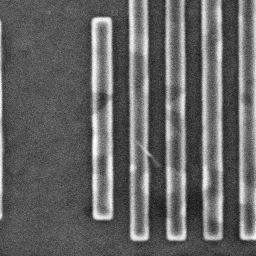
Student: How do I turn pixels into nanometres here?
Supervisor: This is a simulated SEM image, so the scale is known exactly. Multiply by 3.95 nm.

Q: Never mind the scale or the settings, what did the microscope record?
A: wiring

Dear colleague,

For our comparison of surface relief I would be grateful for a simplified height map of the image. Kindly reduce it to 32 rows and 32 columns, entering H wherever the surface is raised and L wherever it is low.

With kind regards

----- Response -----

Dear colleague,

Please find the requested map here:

LLLLLLLLLLLLLLLLHHLLLHHLLHHLLLHH
LLLLLLLLLLLLLLLLHHLLLHHLLHHLLLHH
LLLLLLLLLLLLHLLLHHLLLHHLLHHHLLHH
LLLLLLLLLLLLHHLLHHLLLHHLLHHHLLHH
LLLLLLLLLLLLHHLLHHLLLHHLLHHHLLHH
LLLLLLLLLLLLHHLLHHLLLHHLLHHHLLHH
LLLLLLLLLLLLHHLLHHLLLHHLLHHHLLHH
LLLLLLLLLLLLHHLLHHLLLHHLLLHHLLHH
LLLLLLLLLLLLHHLLHHLLLHHLLLHHLLHH
LLLLLLLLLLLLHHLLHHLLLHHLLHHHLLHH
LLLLLLLLLLLLHHLLHHLLLHHLLHHHLLHH
LLLLLLLLLLLLHHLLHHLLLHHLLHHHLLHH
LLLLLLLLLLLLHHLLHHLLLHHLLLHHLLHH
LLLLLLLLLLLLHHLLHHLLLHHLLLHHLLHH
LLLLLLLLLLLLHHLLHHLLLHHLLLHHLLHH
LLLLLLLLLLLLHHLLHHLLLHHLLLHHLLHH
LLLLLLLLLLLLHHLLHHLLLHHLLLHHLLHH
LLLLLLLLLLLLHHLLHHLLLHHLLLHHLLHH
LLLLLLLLLLLLHHLLHHLLLHHLLLHHLLHH
LLLLLLLLLLLLHHLLHHLLLHHLLLHHLLHH
LLLLLLLLLLLLHHLLHHLLLHHLLLHHLLHH
LLLLLLLLLLLLHHLLHHLLLHHLLLHHLLHH
LLLLLLLLLLLLHHLLHHLLLHHLLLHHLLHH
LLLLLLLLLLLLHHLLHHLLLHHLLLHHLLHH
LLLLLLLLLLLLHHLLHHLLLHHLLLHHLLHH
LLLLLLLLLLLLHHLLHHLLLHHLLLHHLLHH
LLLLLLLLLLLLHHLLHHLLLHHLLLHHLLHH
LLLLLLLLLLLLLLLLLHLLLHHLLLHHLLHH
LLLLLLLLLLLLLLLLHHLLLHHLLLHHLLHH
LLLLLLLLLLLLLLLLLHLLLHHLLLHHLLHH
LLLLLLLLLLLLLLLLLLLLLLLLLLLLLLLL
LLLLLLLLLLLLLLLLLLLLLLLLLLLLLLLL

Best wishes